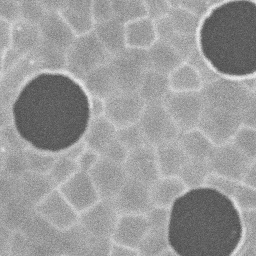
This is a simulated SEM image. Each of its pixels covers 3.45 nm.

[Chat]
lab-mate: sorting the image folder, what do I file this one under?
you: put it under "holes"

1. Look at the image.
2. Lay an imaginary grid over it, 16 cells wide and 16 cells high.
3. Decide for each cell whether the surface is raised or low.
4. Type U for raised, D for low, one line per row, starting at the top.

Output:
UUUUUUUUUUUUUUDD
UUUUUUUUUUUUUDDD
UUUUUUUUUUUUUDDD
UUUUUUUUUUUUUDDD
UUUUUUUUUUUUUUDD
UDDDDUUUUUUUUUUU
UDDDDDUUUUUUUUUU
UDDDDDUUUUUUUUUU
UDDDDUUUUUUUUUUU
UUUUUUUUUUUUUUUU
UUUUUUUUUUUUUUUU
UUUUUUUUUUUUUUUU
UUUUUUUUUUUDDDUU
UUUUUUUUUUUDDDDU
UUUUUUUUUUUDDDDU
UUUUUUUUUUUDDDDU